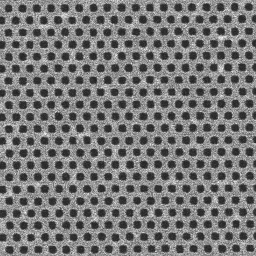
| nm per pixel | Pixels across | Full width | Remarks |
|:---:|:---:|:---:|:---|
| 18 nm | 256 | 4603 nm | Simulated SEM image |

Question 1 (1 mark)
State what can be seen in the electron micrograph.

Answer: a regular array of holes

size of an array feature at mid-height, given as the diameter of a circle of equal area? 161 nm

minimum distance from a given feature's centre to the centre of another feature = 0.246 um